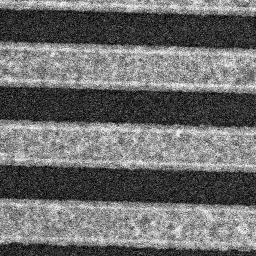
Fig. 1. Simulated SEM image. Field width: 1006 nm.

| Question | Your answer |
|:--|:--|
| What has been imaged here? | one or a few lines or trenches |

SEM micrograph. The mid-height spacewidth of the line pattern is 0.181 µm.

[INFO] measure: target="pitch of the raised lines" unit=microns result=0.308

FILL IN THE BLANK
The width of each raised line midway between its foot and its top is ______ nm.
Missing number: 125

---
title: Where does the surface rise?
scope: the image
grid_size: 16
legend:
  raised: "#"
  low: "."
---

............####
................
................
################
################
................
................
................
################
################
................
................
................
################
################
................